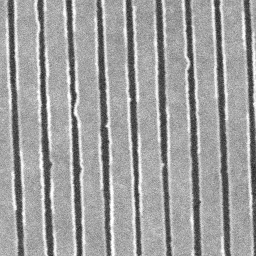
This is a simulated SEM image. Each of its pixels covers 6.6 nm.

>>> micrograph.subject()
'parallel lines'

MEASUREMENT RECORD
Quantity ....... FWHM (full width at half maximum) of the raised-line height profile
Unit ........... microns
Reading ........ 0.149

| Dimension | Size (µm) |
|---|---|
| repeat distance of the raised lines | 0.195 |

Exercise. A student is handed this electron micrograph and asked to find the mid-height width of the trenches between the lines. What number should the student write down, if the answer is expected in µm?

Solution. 0.0478